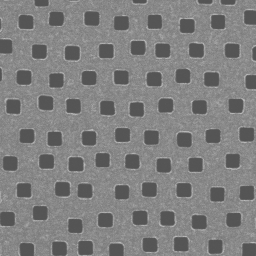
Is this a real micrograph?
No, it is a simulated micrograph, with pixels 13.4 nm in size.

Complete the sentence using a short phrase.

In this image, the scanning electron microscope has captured a regular array of holes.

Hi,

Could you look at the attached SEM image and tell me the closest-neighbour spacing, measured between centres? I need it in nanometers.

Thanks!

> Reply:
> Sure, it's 384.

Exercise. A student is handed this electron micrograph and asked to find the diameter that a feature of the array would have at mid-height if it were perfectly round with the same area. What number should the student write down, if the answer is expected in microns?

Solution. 0.215